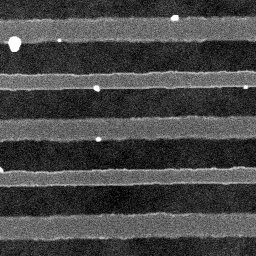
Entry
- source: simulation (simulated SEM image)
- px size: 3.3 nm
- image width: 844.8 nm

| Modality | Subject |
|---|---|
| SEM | lines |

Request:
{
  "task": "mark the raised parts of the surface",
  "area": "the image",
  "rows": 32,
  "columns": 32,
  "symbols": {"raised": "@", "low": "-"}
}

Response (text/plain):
--------------------------------
--------------------------------
----@@@-@@@@@@@@@@@@@@@@@@@@@@@@
@@@@@@@@@@@@@@@@@@@@@@@@@@@@@@@@
@@@@@@@@@@@@@@@@@@@@@@@@@@@@@@@@
-@@-----------------------------
--------------------------------
--------------------------------
--------------------------------
@@@@@@@@@@@@@@@@@@@@@@@@@@@@@@@@
@@@@@@@@@@@@@@@@@@@@@@@@@@@@@@@@
--------------------------------
--------------------------------
--------------------------------
--------------------------------
@@@@@@@@@@@@@@@@@@@@@@@@@@@@@@@@
@@@@@@@@@@@@@@@@@@@@@@@@@@@@@@@@
@------@@-----------------------
--------------------------------
--------------------------------
--------------------------------
@@@@---@@@@@@@@@@@@@@@@@@@@@@@@@
@@@@@@@@@@@@@@@@@@@@@@@@@@@@@@@@
--------------------------------
--------------------------------
--------------------------------
--------------------------------
@@@@@@@@@@@@@@@@@@@@@@@@@@@@@@@@
@@@@@@@@@@@@@@@@@@@@@@@@@@@@@@@@
@@@@@@@@@@@@@@@@@@@@@@@--@@@--@-
--------------------------------
--------------------------------